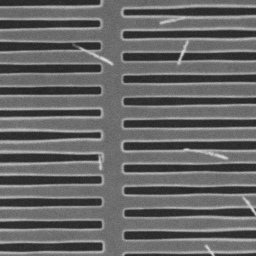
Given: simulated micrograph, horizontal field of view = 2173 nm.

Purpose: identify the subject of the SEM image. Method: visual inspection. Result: groups of lines, slits or small figures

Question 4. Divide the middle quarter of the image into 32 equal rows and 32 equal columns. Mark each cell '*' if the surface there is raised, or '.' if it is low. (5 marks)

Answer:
.........***********************
.........***********************
*********************...........
***************.................
***************.................
.........***********************
.........***********************
.........***********************
***************.................
***************.................
*******************.........****
.........***********************
.........***********************
********************************
***************.................
***************.................
********************************
.........***********************
.........***********************
***************.................
**************..................
***************...............**
.........***********************
.........***********************
.*******************************
***************.................
***************.................
********************************
.........***********************
.........***********************
**********************.......***
***************.................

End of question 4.